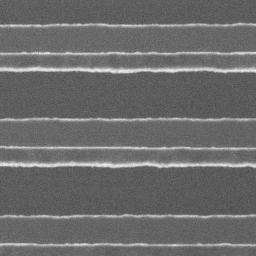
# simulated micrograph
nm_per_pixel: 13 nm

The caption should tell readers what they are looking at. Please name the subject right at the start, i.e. lines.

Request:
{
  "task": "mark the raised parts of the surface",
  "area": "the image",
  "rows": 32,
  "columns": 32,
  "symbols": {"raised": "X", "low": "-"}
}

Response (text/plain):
--------------------------------
--------------------------------
--------------------------------
XXXXXXXXXXXXXXXXXXXXXXXXXXXXXXXX
XXXXXXXXXXXXXXXXXXXXXXXXXXXXXXXX
XXXXXXXXXXXXXXXXXXXXXXXXXXXXXXXX
XXXXXXXXXXXXXXXXXXXXXXXXXXXXXXXX
XXXXXXXXXXXXXXXXXXXXXXXXXXXXXXXX
XXXXXXXXXXXXXXXXXXXXXXXXXXXXXXXX
--------------------------------
--------------------------------
--------------------------------
--------------------------------
--------------------------------
--------------------------------
XXXXXXXXXXXXXXXXXXXXXXXXXXXXXXXX
XXXXXXXXXXXXXXXXXXXXXXXXXXXXXXXX
XXXXXXXXXXXXXXXXXXXXXXXXXXXXXXXX
XXXXXXXXXXXXXXXXXXXXXXXXXXXXXXXX
XXXXXXXXXXXXXXXXXXXXXXXXXXXXXXXX
XXXXXXXXXXXXXXXXXXXXXXXXXXXXXXXX
--------------------------------
--------------------------------
--------------------------------
--------------------------------
--------------------------------
--------------------------------
XXXXXXXXXXXXXXXXXXXXXXXXXXXXXXXX
XXXXXXXXXXXXXXXXXXXXXXXXXXXXXXXX
XXXXXXXXXXXXXXXXXXXXXXXXXXXXXXXX
XXXXXXXXXXXXXXXXXXXXXXXXXXXXXXXX
XXXXXXXXXXXXXXXXXXXXXXXXXXXXXXXX